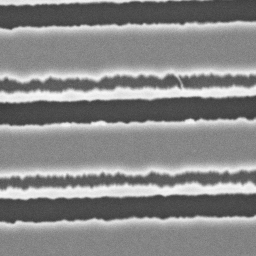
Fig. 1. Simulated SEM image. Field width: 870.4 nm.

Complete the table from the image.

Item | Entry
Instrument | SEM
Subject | lines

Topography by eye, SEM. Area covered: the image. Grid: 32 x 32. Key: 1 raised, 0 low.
10100000000000000000000000000000
00000000000000000000000000000000
00000000000000000000000000000000
00111111111111111111111111111111
11111111111111111111111111111111
11111111111111111111111111111111
11111111111111111111111111111111
11111111111111111111111111111111
11111111111111111111111111111111
11111111111111111111111111111111
11111111111111111111111111111111
11111111111111111111111111111111
11111111110100000000000000000000
00000000000000000000000000000000
00000000000000000000000000000000
00000001111111111111111111111111
11111111111111111111111111111111
11111111111111111111111111111111
11111111111111111111111111111111
11111111111111111111111111111111
11111111111111111111111111111111
11111111111111111111111111111111
11111111111111111111111111111111
11111111111111111111111111111111
11111111111111110000000000000000
00000000000000000000000000000000
00000000000000000000000000000000
00000000000100001111011111111111
11111111111111111111111111111111
11111111111111111111111111111111
11111111111111111111111111111111
11111111111111111111111111111111